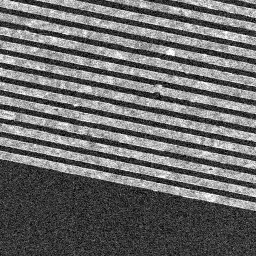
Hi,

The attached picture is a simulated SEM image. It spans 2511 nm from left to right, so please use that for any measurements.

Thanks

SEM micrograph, parallel lines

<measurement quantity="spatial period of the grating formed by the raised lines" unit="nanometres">133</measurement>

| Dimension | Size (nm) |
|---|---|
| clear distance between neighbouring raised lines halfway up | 60.1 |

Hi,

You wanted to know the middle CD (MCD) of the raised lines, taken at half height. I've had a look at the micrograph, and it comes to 72 nm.